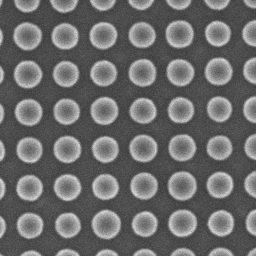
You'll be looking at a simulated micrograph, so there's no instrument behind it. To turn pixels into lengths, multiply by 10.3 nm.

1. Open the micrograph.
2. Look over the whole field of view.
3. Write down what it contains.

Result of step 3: a regular array of raised bodies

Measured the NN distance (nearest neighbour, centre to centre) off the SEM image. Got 0.384 micrometres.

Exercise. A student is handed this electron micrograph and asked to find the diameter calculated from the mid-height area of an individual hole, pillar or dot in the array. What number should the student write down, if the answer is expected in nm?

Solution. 261